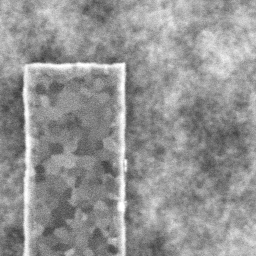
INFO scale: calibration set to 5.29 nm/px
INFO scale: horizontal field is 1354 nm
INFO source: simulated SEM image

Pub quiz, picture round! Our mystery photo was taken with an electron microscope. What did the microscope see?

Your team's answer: one or a few lines or trenches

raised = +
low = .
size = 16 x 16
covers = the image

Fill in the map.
................
................
................
................
..++++++........
..++++++........
..++++++........
..++++++........
..++++++........
..++++++........
..++++++........
..++++++........
..++++++........
..++++++........
..++++++........
..++++++........